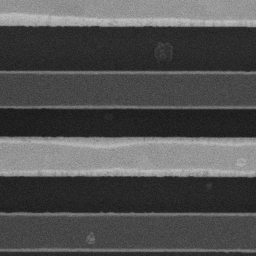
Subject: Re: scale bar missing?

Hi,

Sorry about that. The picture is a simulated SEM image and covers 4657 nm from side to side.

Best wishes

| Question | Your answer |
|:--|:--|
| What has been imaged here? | lines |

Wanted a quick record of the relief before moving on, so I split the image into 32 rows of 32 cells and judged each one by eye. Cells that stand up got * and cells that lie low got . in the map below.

********************************
********************************
.....***************************
................................
................................
................................
................................
................................
................................
********************************
********************************
********************************
********************************
.****.**************************
................................
................................
................................
................................
********************************
********************************
********************************
********************************
................................
................................
................................
................................
................................
********************************
********************************
********************************
********************************
................................